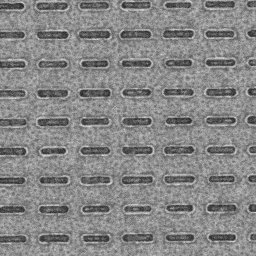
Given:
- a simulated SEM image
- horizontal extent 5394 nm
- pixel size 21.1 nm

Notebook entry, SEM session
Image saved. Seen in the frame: a regular array of holes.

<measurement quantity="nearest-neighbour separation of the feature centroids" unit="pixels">29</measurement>